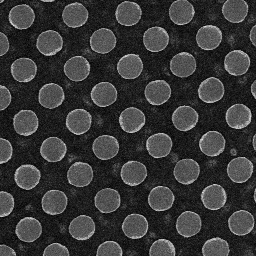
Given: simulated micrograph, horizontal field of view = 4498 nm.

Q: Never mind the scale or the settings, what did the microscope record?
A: a regular array of raised bodies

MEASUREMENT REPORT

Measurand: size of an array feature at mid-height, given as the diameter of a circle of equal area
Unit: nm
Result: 443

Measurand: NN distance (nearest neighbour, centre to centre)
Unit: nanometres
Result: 655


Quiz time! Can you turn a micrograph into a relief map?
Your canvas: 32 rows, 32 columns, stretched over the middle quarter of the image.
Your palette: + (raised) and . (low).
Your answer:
++++++.......+++++++.......+++++
++++++.......+++++++.......+++++
++++++........+++++.........++++
.++++..........+++..............
......................+++.......
........++++.........+++++......
.......++++++.......+++++++.....
.......++++++.......+++++++.....
.......++++++........+++++......
........++++.........++++.......
.........+......................
...++..........++++.........++++
.+++++........++++++.......+++++
.++++++.......++++++.......+++++
.++++++.......++++++.......+++++
.++++++.......++++++........++++
.+++++.........++++..........++.
...+...................++.......
........+++++........+++++......
.......++++++........++++++.....
.......+++++++.......++++++.....
+......+++++++.......++++++.....
........+++++........+++++......
.........+++....................
................+++..........+++
..++++.........+++++........++++
.++++++.......+++++++.......++++
.++++++.......+++++++.......++++
.++++++.......++++++........++++
.+++++.........++++..........+++
...++...........................
..........++..........+++++.....